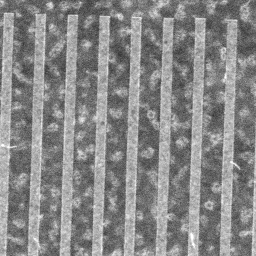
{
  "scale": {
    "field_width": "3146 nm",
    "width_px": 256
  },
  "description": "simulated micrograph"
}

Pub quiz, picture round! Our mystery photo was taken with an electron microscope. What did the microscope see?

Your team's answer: parallel lines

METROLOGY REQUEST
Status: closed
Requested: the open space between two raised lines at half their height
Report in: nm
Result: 276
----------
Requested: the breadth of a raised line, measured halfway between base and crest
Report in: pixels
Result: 9.24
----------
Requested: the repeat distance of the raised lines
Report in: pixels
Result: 31.9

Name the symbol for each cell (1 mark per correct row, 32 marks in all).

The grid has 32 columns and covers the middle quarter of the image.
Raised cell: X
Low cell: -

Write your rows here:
-XX------XX------XX------XX-----
-XX------XX------XX------XX-----
-XX------XX------XX---XX-XX-----
-XX------XX------XX------XX-----
-XX------XX------XX---X-XXX-----
-XX------XX------XX-----XXX-----
-XX------XX-----XXX-----XXX-----
-XX------XX-----XXX-----XXX-----
-XX-----XXX-----XXX-----XXXX----
XXX-----XXX-----XX------XXX-----
XXX-----XXX-----XX------XXX-----
XXX-----XX------XX------XXX-----
XX------XX------XX---X--XXX-----
XXX-----XX------XX------XXX-----
XXX-----XX------XX------XXX-----
XX------XX------XX------XX------
XX------XXX-----XX------XX------
XX------XX------XX------XX------
XX------XX------XX------XX------
XX------XX------XX------XX------
XX------XX------XX------XX------
XX------XX------XX------XX------
XX------XX------XX------XX------
XX------XX------XX------XX------
XX------XX------XX------XX------
XX------XX------XX------XX------
XX------XX------XX------XX------
XX------XX------XX------XX------
XX------XX------XX------XX------
XX------XX------XX------XX------
XX------XX------XX------XX------
XX------XX------XX------XX------